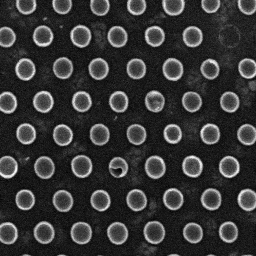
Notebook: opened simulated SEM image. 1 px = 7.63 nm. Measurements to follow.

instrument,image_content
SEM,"a regular array of raised bodies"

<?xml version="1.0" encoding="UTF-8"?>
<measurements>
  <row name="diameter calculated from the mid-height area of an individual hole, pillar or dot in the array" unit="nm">150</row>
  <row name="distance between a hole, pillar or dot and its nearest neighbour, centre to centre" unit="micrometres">0.279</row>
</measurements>